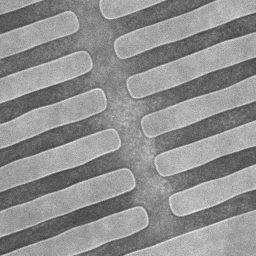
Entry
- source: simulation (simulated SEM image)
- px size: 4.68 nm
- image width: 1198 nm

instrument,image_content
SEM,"groups of lines, slits or small figures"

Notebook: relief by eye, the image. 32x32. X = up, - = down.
XXXX---------XXXXXX-------XXXXXX
X-------X----XXXX-------XXXXXXXX
-----XXXXX-----------XXXXXXXX---
--XXXXXXXX--------XXXXXXXX------
XXXXXXXX-------XXXXXXXXX-------X
XXXXX---------XXXXXX-------XXXXX
XXX-------X---XXXX-------XXXXXXX
-------XXXX-----------XXXXXXXXX-
----XXXXXXX--------XXXXXXXXX----
-XXXXXXXXX-------XXXXXXXX-------
XXXXXXX---------XXXXXXX-------XX
XXXX-------XX---XXXX-------XXXXX
X-------XXXXX-----------XXXXXXXX
-----XXXXXXXX--------XXXXXXXX---
---XXXXXXXX-------XXXXXXXX------
XXXXXXXX----------XXXXXX-------X
XXXXX-------XXX---XXX-------XXXX
XXX-------XXXXX----------XXXXXXX
-------XXXXXXXX-------XXXXXXXXX-
----XXXXXXXX--------XXXXXXXX----
-XXXXXXXXX---------XXXXXXX------
XXXXXXX-------XX----XXX------XXX
XXXX-------XXXXXX----------XXXXX
XX------XXXXXXXXX-------XXXXXXXX
-----XXXXXXXXX-------XXXXXXXX---
---XXXXXXXXX---------XXXXXX-----
XXXXXXXXX------XXX----XXX------X
XXXXXX------XXXXXX----------XXXX
XXX------XXXXXXXXX-------XXXXXXX
-------XXXXXXXXX------XXXXXXXXXX
----XXXXXXXXX-------XXXXXXXXXXXX
--XXXXXXXXX------XXXXXXXXXXXXXXX